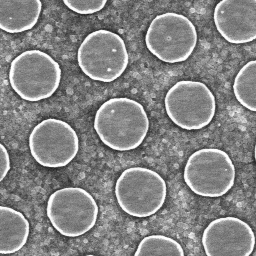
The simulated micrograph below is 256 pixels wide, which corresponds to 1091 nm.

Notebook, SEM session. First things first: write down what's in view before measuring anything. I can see a regular array of raised bodies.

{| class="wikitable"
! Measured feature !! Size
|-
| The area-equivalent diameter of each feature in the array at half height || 210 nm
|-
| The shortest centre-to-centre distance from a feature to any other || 300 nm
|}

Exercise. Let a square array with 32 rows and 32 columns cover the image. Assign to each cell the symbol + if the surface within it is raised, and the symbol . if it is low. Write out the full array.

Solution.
+++++...+++++..............+++++
+++++.....++...............+++++
+++++..............++++....+++++
++++...............+++++...+++++
...........++++...++++++....++++
..........+++++...++++++........
...++.....++++++...+++++........
..+++++...++++++....+++.........
.++++++...++++++..............++
.+++++++...++++...............++
.++++++...............+++....+++
..+++++..............+++++...+++
....+.........++.....++++++...++
.............+++++...++++++....+
............++++++...++++++.....
.....+++....++++++....++++......
....+++++...++++++..............
....++++++...+++++..............
+...++++++....+++...............
+...+++++...............++++....
+....+++...............++++++...
+...............+++....++++++...
...............+++++...++++++...
..............+++++++...+++++...
......+++++....++++++.....+.....
......++++++...+++++............
++....++++++....+++.............
+++...++++++...............+++..
++++...++++...............+++++.
+++......................+++++++
+++...............++++...+++++++
++...............++++++...+++++.